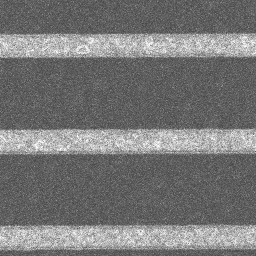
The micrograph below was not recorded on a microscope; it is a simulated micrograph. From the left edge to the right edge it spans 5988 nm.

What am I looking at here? one or a few lines or trenches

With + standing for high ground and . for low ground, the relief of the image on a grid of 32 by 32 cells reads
++++++++++++++++++++++++++++++++
++++++++++++++++++++++++++++++++
++++++++++++++++++++++++++++++++
++++++++++++++++++++++++++++++++
..........++....................
................................
..........+.....................
++++++++++++++++++++++++++++++++
++++++++++++++++++++++++++++++++
++++++++++++++++++++++++++++++++
++++++++++++++++++++++++++++++++
++++++++++++++++++++++++++++++++
++++++++++++++++++++++++++++++++
++++++++++++++++++++++++++++++++
++++++++++++++++++++++++++++++++
++++++++++++++++++++++++++++++++
................................
................................
................................
++++++++++++++++++++++++++++++++
++++++++++++++++++++++++++++++++
++++++++++++++++++++++++++++++++
++++++++++++++++++++++++++++++++
++++++++++++++++++++++++++++++++
++++++++++++++++++++++++++++++++
++++++++++++++++++++++++++++++++
++++++++++++++++++++++++++++++++
++++++++++++++++++++++++++++++++
................................
................................
................................
++++++++++++++++++++++++++++++++